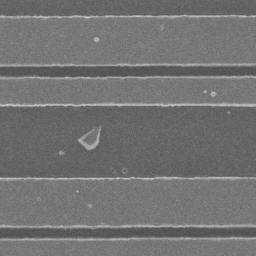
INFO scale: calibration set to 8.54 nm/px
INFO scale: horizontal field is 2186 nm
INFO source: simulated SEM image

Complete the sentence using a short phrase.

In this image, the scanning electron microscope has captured lines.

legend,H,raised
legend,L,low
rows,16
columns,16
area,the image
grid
LLLLLLLLLLLLLLLL
HHHHHHHHHHHHHHHH
HHHHHHHHHHHHHHHH
HHHHHHHHHHHHHHHH
HHHHHHHHHHHHHHHH
HHHHHHHHHHHHHHHH
HHHHHHHHHHHHHHHH
LLLLLLLLLLLLLLLL
LLLLLLLLLLLLLLLL
LLLLLLLLLLLLLLLL
LLLLLLLLLLLLLLLL
HHHHHHHHHHHHHHHH
HHHHHHHHHHHHHHHH
HHHHHHHHHHHHHHHH
HHHHHHHHHHHHHHHH
HHHHHHHHHHHHHHHH